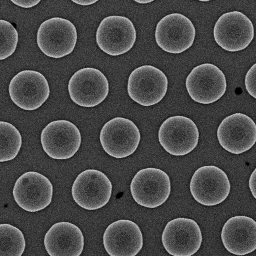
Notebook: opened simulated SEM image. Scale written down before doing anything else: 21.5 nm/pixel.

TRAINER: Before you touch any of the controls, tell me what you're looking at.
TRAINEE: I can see an array of small figures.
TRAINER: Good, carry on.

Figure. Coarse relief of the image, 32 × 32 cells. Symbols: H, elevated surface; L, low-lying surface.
LLHHLLLLLLHLLLLLLLLLLLLLLLLLLLLL
LLLLLLLLLLLLLLLLLLLLLLLLLLLLLHLL
LLLLLLHHLLLLLHHHLLLLHHHHLLLHHHHL
HHLLLHHHHLLLHHHHHLLLHHHHLLLHHHHH
HHLLLHHHHHLLHHHHHLLHHHHHLLLHHHHH
HHLLLHHHHLLLHHHHHLLLHHHHLLLHHHHL
HHLLLHHHHLLLLHHHLLLLLHHLLLLLLLLL
LLLLLLLLLLLLLLLLLLLLLLLLLLLLLLLL
LLLLLLLLLLLLLLLLLHHLLLLLHHHLLLLH
LLHHHLLLLHHHHLLLHHHHHLLLHHHHLLLH
LHHHHHLLLHHHHLLLHHHHHLLHHHHHLLLH
LHHHHHLLLHHHHLLLHHHHHLLLHHHHLLLH
LLHHHHLLLHHHHLLLLHHHLLLLHHHLLLLL
LLLHHLLLLLLLLLLLLLLLLLLLLLLLLLLL
LLLLLLLLLLLLLLLLLLLLLLLLLLLLLHHL
HLLLLLHHHLLLLHHHHLLLHHHHLLLLHHHH
HHLLLHHHHHLLLHHHHLLLHHHHHLLHHHHH
HHHLLHHHHHLLLHHHHLLLHHHHHLLHHHHH
HHLLLHHHHHLLLHHHHLLLHHHHLLLLHHHL
HHLLLLHHHLLLLLHHLLLLLLLLLLLLLLLL
LLLLLLLLLLLLLLLLLLLLLLLLLLLLLLLL
LLLLLLLLLLHHHLLLLHHHLLLLHHHHLLLL
LLHHHHLLLHHHHHLLLHHHHLLLHHHHHLLH
LLHHHHLLLHHHHHLLHHHHHLLLHHHHHLLH
LLHHHHLLLHHHHHLLLHHHHLLLHHHHLLLL
LLHHHHLLLLHHHLLLLHHHLLLLLHHLLLLL
LLLLLLLLLLLLLLLLLLLLLLLLLLLLLLLL
LLLLLLLLLLLLLLLLLLLLLLHHLLLLLHHH
HHLLLLHHHHLLLHHHHLLLLHHHHLLLHHHH
HHHLLLHHHHLLLHHHHHLLHHHHHLLLHHHH
HHHLLLHHHHLLLHHHHHLLHHHHHLLLHHHH
HHHLLLHHHHLLLHHHHLLLLHHHLLLLLHHL